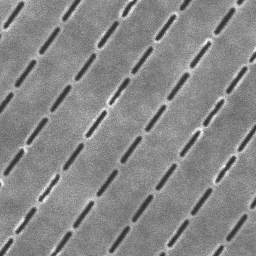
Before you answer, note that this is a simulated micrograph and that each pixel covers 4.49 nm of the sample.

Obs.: a regular array of holes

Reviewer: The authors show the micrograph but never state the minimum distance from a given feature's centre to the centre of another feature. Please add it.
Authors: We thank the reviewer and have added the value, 177 nm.